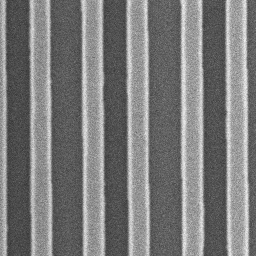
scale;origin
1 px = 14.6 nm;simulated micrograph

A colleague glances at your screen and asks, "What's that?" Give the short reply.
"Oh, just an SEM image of lines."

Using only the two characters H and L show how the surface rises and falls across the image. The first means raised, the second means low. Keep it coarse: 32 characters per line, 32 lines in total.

HLLLHHLLLLHHHLLLHHLLLLLHHLLLHHHL
HLLLHHLLLLHHHLLLHHLLLLLHHLLLHHHL
HLLLHHLLLLHHHLLLHHLLLLLHHLLLHHHL
HLLLHHLLLLHHHLLLHHLLLLLHHLLLHHHL
HLLLHHLLLLHHHLLLHHLLLLLHHLLLHHHL
HLLLHHLLLLHHHLLLHHLLLLLHHLLLHHHL
HLLLHHLLLLHHHLLLHHLLLLLHHLLLHHHL
HLLLHHLLLLHHHLLLHHLLLLLHHLLLHHHL
HLLLHHLLLLHHHLLLHHLLLLLHHLLLHHHL
HLLLHHLLLLHHHLLLHHLLLLLHHLLLHHHL
HLLLHHLLLLHHHLLLHHLLLLLHHLLLHHHL
HLLLHHLLLLHHHLLLHHLLLLLHHLLLHHHL
HLLLHHLLLLHHHLLLHHLLLLLHHLLLHHHL
HLLLHHLLLLHHHLLLHHLLLLLHHLLLHHHL
HLLLHHLLLLHHHLLLHHLLLLLHHLLLHHHL
HLLLHHLLLLHHHLLLHHLLLLLHHLLLHHHL
HLLLHHLLLLHHHLLLHHLLLLLHHLLLHHHL
HLLLHHLLLLHHHLLLHHLLLLLHHLLLHHHL
HLLLHHLLLLHHHLLLHHLLLLLHHLLLHHHL
HLLLHHLLLLHHHLLLHHLLLLLHHLLLHHHL
HLLLHHLLLLHHHLLLHHLLLLLHHLLLHHHL
HLLLHHLLLLHHHLLLHHLLLLLHHLLLLHHL
HLLLHHLLLLHHHLLLHHLLLLLHHLLLLHHL
HLLLHHLLLLHHHLLLHHHLLLLHHLLLHHHL
HLLLHHLLLLHHHLLLHHHLLLLHHLLLHHHL
HLLLHHLLLLHHHLLLHHHLLLLHHLLLLHHL
HLLLHHLLLLHHHLLLHHHLLLLHHLLLLHHL
HLLLHHLLLLLHHLLLHHHLLLLHHLLLLHHL
HLLLHHLLLLLHHLLLHHHLLLLHHLLLLHHL
HLLLHHLLLLLHHLLLHHHLLLLHHLLLLHHL
HLLLHHLLLLLHHLLLHHHLLLLHHLLLLHHL
HLLLHHLLLLLHHLLLHHHLLLLHHLLLLHHL